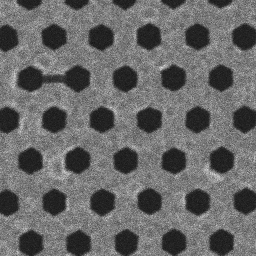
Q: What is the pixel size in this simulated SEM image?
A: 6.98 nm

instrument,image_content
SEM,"a regular array of holes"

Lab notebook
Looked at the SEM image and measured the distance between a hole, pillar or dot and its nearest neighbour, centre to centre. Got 0.329 µm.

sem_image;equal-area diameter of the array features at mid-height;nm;181